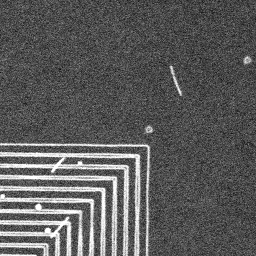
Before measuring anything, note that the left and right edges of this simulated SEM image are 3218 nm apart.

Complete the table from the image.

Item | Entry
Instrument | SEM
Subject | groups of lines, slits or small figures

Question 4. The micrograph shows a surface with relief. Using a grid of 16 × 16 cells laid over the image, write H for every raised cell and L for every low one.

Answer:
HHHHHHHHHHHHHHHH
HHHHHHHHHHHHHHHH
HHHHHHHHHHHHHHHH
HHHHHHHHHHHHHHHH
HHHHHHHHHHHHHHHH
HHHHHHHHHHHHHHHH
HHHHHHHHHHHHHHHH
HHHHHHHHHHHHHHHH
HHHHHHHHHHHHHHHH
LLLLLLLLLHHHHHHH
LLLLLLLLLHHHHHHH
LLLLLLLLLHHHHHHH
LLLLLLLLLHHHHHHH
LLLLLLLLLHHHHHHH
LLLLLLLLLHHHHHHH
LLLLLLLLLHHHHHHH